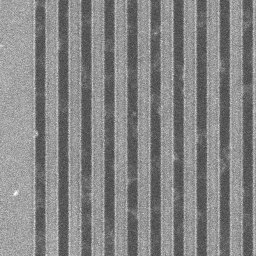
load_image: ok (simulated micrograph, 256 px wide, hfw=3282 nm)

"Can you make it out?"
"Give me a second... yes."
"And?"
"parallel lines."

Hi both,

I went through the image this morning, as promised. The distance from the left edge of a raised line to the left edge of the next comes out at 23.1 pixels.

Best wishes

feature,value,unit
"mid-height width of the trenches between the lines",131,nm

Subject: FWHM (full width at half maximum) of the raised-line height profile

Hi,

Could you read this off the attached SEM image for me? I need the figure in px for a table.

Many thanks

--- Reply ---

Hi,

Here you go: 12.8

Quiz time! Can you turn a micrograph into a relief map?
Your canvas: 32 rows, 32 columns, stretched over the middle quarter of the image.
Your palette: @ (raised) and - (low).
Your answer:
@---@@@---@@@---@@@--@@@---@@@--
@---@@@---@@@---@@@--@@@---@@@--
@---@@@---@@@---@@@--@@@---@@@--
@---@@@---@@@---@@@--@@@---@@@--
@---@@@---@@@---@@@--@@@---@@@--
@---@@@---@@@---@@@--@@@---@@@--
@---@@@---@@@---@@@--@@@---@@@--
@---@@@---@@@---@@@--@@@---@@@--
@---@@@---@@@---@@@--@@@---@@@--
@---@@@---@@@---@@@--@@@---@@@--
@---@@@---@@@---@@@--@@@---@@@--
@---@@@---@@@---@@@--@@@---@@@--
@---@@@---@@@---@@@--@@@---@@@--
@---@@@---@@@---@@@--@@@---@@@--
@---@@@---@@@---@@@--@@@---@@@--
@---@@@---@@@---@@@--@@@---@@@--
@---@@@---@@@---@@@--@@@---@@@--
@---@@@---@@@---@@@--@@@---@@@--
@---@@@---@@@---@@@--@@@---@@@--
@---@@@---@@@---@@@--@@@---@@@--
@---@@@---@@@---@@@--@@@---@@@--
@---@@@---@@@---@@@--@@@---@@@--
@---@@@---@@@---@@@--@@@---@@@--
@---@@@---@@@---@@@--@@@---@@@--
@---@@@---@@@---@@@--@@@---@@@--
@---@@@---@@@---@@@--@@@---@@@--
@---@@@---@@@---@@@--@@@---@@@--
@---@@@---@@@---@@@--@@@---@@@--
@---@@@---@@@---@@@--@@@---@@@--
@---@@@---@@@---@@@--@@@---@@@--
@---@@@---@@@---@@@--@@@---@@@--
@---@@@---@@@---@@@--@@@---@@@--